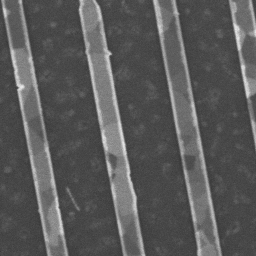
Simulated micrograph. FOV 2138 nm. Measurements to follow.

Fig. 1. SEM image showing one or a few lines or trenches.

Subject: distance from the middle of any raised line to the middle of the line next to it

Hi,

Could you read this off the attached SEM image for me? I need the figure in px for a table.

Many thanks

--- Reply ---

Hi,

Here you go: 75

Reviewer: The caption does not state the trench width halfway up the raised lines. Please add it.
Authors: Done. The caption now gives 468 nm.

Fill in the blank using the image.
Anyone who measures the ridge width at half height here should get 19.3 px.